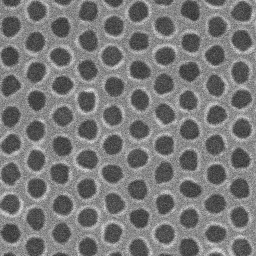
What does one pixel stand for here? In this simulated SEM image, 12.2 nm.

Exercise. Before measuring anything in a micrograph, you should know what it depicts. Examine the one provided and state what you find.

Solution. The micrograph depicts a regular array of holes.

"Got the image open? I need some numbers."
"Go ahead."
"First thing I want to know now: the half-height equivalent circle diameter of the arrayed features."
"260 nm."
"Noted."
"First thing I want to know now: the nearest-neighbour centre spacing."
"0.343 micrometres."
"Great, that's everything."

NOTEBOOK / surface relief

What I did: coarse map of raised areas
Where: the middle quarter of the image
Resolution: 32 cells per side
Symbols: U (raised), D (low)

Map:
DUUDDDDDUUDDDUUUDDDDDUUUUDUUUDDD
UUUDDDDDUUUUUUUUDDDDDDUUUUUUUDDD
UUUUDDDDUUUUUUUUDDDDDDUUDDUUUDDD
DUUUDDDDUUUDDDUUUDDDDUUDDDDUUDDD
DDUUUUDUUUDDDDDUUUUUUUUDDDDUUUUD
DDDUUUUUUUDDDDDUUUUUUUDDDDDDUUUU
DDUUUUUUUUDDDDDUUUDDUUDDDDDUUUDD
DUUDDDDDUUUDDDDUUDDDDUUDDUUUUDDD
UUUDDDDDUUUUUUUUDDDDDUUUUUUUUDDD
UUUDDDDDUUUUUUUUDDDDDUUUUUUUUDDD
DUUDDDDDUUUDDUUUUDDDDUUDDDUUUDDD
DDUUDDDUUUDDDDUUUUDDDUUDDDDDUUDD
DDUUUUUUUUDDDDDUUUUUUUUDDDDDUUUU
DDDUUUUUUUDDDDDUUUUUUUUDDDDDUUUU
DDUUDDDDUUDDDDDUUDDDUUUUDDDDUUDD
DUUUDDDDUUUDDUUUDDDDDUUUUUUUUDDD
UUUDDDDDDUUUUUUUDDDDDDUUUUUUUDDD
UUUDDDDDUUUUDUUUDDDDDUUUUUUUUDDD
DUUUDDDDUUDDDDDUUDDDDUUDDDDUUDDD
DDUUUUUUUUDDDDDUUUUUUUUDDDDDUUUU
DDUUUUUUUUDDDDDUUUUUUUDDDDDDUUUU
DDUUUDDUUUDDDDDUUDDDUUUDDDDDUUDD
DDUDDDDDUUUDDUUUDDDDDUUUDDDUUDDD
UUUDDDDDDUUUUUUUDDDDDUUUUUUUUDDD
UUUDDDDDDUUUUUUUDDDDDUUUUDUUUDDD
DUUUDDDDUUDDDDUUDDDDUUUUDDDUUDDD
DUUUUUDUUDDDDDDUUUUUUUUDDDDDUUDD
DUUUUUUUUDDDDDDUUUUUUUDDDDDDUUUU
DUUUUDUUUUDDDDDUUUUUUUDDDDDUUUUU
DUUUDDDDUUUDDDUUUDDDUUUDDDUUUDDD
UUUDDDDDUUUUUUUUDDDDDUUUUUUUUDDD
UUUDDDDDUUUUUUUUDDDDDUUUUUUUUDDD